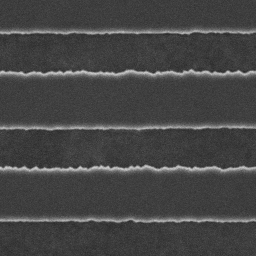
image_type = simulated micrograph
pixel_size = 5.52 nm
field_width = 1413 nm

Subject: lines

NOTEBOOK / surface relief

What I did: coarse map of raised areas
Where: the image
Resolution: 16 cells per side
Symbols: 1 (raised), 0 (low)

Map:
1111111111111111
1111111111111111
0000000000000000
0000000000000000
0000000010001000
1111111111111111
1111111111111111
1111111111111111
0000000000000000
0000000000000000
1000001011010101
1111111111111111
1111111111111111
1111111111111111
0000000000000000
0000000000000000